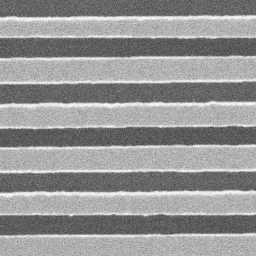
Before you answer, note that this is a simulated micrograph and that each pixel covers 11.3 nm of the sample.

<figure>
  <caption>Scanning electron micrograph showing lines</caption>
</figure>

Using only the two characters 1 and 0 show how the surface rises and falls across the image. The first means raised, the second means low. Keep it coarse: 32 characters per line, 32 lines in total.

00000000000000000000000000000000
00000000000000000000000000000000
11111111111111111111111111111111
11111111111111111111111111111111
11111111111111111111111111111111
00000000000000000000000000000000
00000000000000000000000000000000
11111111111111111111111111111111
11111111111111111111111111111111
11111111111111111111111111111111
00000000000000000000000000000000
00000000000000000000000000000000
00000000000000000000000000000000
11111111111111111111111111111111
11111111111111111111111111111111
11111111111111111111111111111111
00000000000000000000000000000000
00000000000000000000000000000000
00000110111111111111111111111111
11111111111111111111111111111111
11111111111111111111111111111111
11101100000000000000000000000000
00000000000000000000000000000000
00000000000000000000000000000000
11111111111111111111111111111111
11111111111111111111111111111111
11111111111111111111111111111111
00000000000000000000000000000000
00000000000000000000000000000000
00001111111111111111111111111111
11111111111111111111111111111111
11111111111111111111111111111111